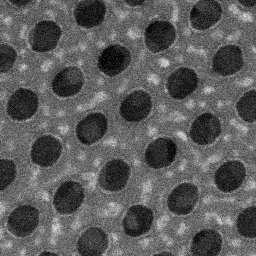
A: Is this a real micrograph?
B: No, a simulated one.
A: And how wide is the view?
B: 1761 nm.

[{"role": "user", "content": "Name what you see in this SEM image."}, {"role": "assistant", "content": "a regular array of raised bodies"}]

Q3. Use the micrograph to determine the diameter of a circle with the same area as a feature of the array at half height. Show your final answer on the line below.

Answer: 235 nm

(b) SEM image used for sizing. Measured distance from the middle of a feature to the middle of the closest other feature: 0.351 micrometres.